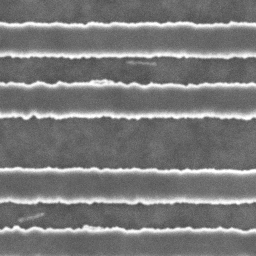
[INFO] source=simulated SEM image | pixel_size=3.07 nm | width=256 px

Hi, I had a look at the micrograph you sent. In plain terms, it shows lines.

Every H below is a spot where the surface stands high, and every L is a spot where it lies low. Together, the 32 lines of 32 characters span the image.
LLLLLLLLLLLLLLLLLLLLLLLLLLLLLLLL
LLLLLLLLLLLLLLLLLLLLLLLLLLLLLLLL
LLLLLLLLLLLLLLLLLLLLLLLLLLLLLLLL
HHHHHHHHHHHHHHHHHHHHHHHHHHHHHHHH
HHHHHHHHHHHHHHHHHHHHHHHHHHHHHHHH
HHHHHHHHHHHHHHHHHHHHHHHHHHHHHHHH
HHHHHHHHHHHHHHHHHHHHHHHHHHHHHHHH
LLLLLLLLLLLLLLLLLLLLLLLLLLLLLLLL
LLLLLLLLLLLLLLLLLLLLLLLLLLLLLLLL
LLLLLLLLLLLLLLLLLLLLLLLLLLLLLLLL
HHHLHHLHHHHHLHHHLLLLLLLLLHLHLHLH
HHHHHHHHHHHHHHHHHHHHHHHHHHHHHHHH
HHHHHHHHHHHHHHHHHHHHHHHHHHHHHHHH
HHHHHHHHHHHHHHHHHHHHHHHHHHHHHHHH
HHHHHHHHHHHHHHHHHHHHHHHHHHHHHHHH
LLLLLLLLLLLLLLLLLLLLLLLLLLLLLLLL
LLLLLLLLLLLLLLLLLLLLLLLLLLLLLLLL
LLLLLLLLLLLLLLLLLLLLLLLLLLLLLLLL
LLLLLLLLLLLLLLLLLLLLLLLLLLLLLLLL
LLLLLLLLLLLLLLLLLLLLLLLLLLLLLLLL
LLLLLLLLLLLLLLLLLLLLLLLLLLLLLLLL
HHHHHHHHHHHHHHHHHHHHHHHHHHHHHHHH
HHHHHHHHHHHHHHHHHHHHHHHHHHHHHHHH
HHHHHHHHHHHHHHHHHHHHHHHHHHHHHHHH
HHHHHHHHHHHHHHHHHHHHHHHHHHHHHHHH
LLLLLLLLLLLLLLLLLLLLLLLLLLLLLLLL
LLLLLLLLLLLLLLLLLLLLLLLLLLLLLLLL
LLLLLLLLLLLLLLLLLLLLLLLLLLLLLLLL
LHHLHLLLLLLLLLHLLLLLLLLHLLLLLLLL
HHHHHHHHHHHHHHHHHHHHHHHHHHHHHHHH
HHHHHHHHHHHHHHHHHHHHHHHHHHHHHHHH
HHHHHHHHHHHHHHHHHHHHHHHHHHHHHHHH